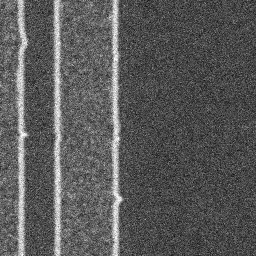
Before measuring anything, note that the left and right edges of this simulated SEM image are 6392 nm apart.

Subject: one or a few lines or trenches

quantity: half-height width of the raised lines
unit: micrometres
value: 1.45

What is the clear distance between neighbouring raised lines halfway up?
902 nm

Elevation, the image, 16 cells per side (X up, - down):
X---XXX---------
X---XXX---------
XX--XXX---------
X---XXX---------
X---XXX---------
X---XXX---------
X---XXX---------
X---XXX---------
X---XXX---------
X---XXX---------
X---XXX---------
X---XXX---------
X---XXX---------
X---XXX---------
X---XXX---------
X---XXX---------